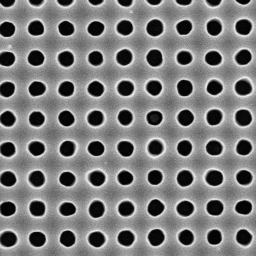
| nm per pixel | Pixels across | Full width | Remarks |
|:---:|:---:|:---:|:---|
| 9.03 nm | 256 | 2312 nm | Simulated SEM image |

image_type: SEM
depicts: a regular array of holes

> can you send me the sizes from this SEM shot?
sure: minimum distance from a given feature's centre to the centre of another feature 263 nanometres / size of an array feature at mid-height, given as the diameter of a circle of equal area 143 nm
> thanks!